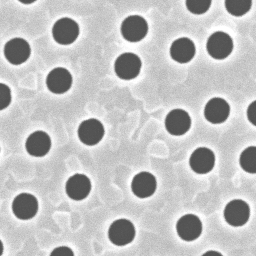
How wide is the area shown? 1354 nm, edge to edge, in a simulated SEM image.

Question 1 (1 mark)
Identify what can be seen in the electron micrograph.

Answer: a regular array of holes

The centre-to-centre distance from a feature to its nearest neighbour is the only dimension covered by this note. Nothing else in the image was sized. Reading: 263 nm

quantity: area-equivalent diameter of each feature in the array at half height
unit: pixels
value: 27.4